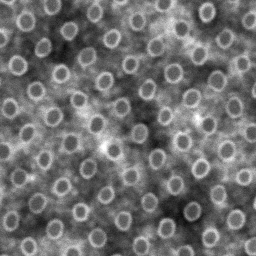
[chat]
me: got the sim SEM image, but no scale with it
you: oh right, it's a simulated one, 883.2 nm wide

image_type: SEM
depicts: a regular array of raised bodies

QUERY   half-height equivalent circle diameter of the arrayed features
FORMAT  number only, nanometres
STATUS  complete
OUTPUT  56.1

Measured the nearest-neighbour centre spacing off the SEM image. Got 106 nanometres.